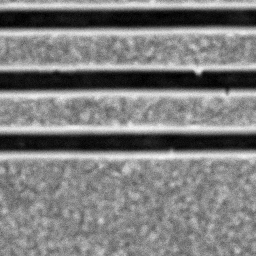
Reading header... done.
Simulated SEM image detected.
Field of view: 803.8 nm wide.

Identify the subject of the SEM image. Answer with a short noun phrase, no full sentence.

one or a few lines or trenches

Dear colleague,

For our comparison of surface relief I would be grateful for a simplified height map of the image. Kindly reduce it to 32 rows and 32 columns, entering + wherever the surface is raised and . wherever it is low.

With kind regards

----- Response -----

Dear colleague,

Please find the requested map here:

++++++++++++++++++++++++++++++++
................................
................................
................................
++++++++++++++++++++++++++++++++
++++++++++++++++++++++++++++++++
++++++++++++++++++++++++++++++++
++++++++++++++++++++++++++++++++
++++++++++++++++++++++++++++++++
................................
................................
................................
++++++++++++++++++++++++++++++++
++++++++++++++++++++++++++++++++
++++++++++++++++++++++++++++++++
++++++++++++++++++++++++++++++++
................................
................................
................................
++++++++++++++++++++++++++++++++
++++++++++++++++++++++++++++++++
++++++++++++++++++++++++++++++++
++++++++++++++++++++++++++++++++
++++++++++++++++++++++++++++++++
++++++++++++++++++++++++++++++++
++++++++++++++++++++++++++++++++
++++++++++++++++++++++++++++++++
++++++++++++++++++++++++++++++++
++++++++++++++++++++++++++++++++
++++++++++++++++++++++++++++++++
++++++++++++++++++++++++++++++++
++++++++++++++++++++++++++++++++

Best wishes